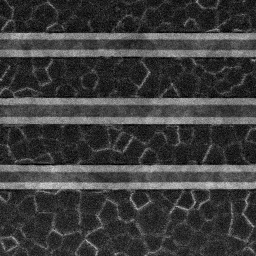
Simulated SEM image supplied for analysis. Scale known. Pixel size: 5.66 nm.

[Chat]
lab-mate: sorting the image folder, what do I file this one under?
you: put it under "one or a few lines or trenches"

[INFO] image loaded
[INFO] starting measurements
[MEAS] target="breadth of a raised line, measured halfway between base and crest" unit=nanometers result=94.7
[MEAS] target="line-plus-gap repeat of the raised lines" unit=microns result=0.374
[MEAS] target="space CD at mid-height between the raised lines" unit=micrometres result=0.274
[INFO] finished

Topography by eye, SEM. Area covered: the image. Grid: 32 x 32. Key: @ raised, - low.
--------------------------------
--------------------------------
--------------------------------
--------------------------------
--------------------------------
@@@@@@@@@@@@@@@@@@@@@@@@@@@@@@@@
@@@@@@@@@@@@@@@@@@@@@@@@@@@@@@@@
--------------------------------
--------------------------------
--------------------------------
--------------------------------
--------------------------------
--------------------------------
@@@@@@@@@@@@@@@@@@@@@@@@@@@@@@@@
@@@@@@@@@@@@@@@@@@@@@@@@@@@@@@@@
--------------------------------
--------------------------------
--------------------------------
--------------------------------
--------------------------------
--------------------------------
@@@@@@@@@@@@@@@@@@@@@@@@@@@@@@@@
@@@@@@@@@@@@@@@@@@@@@@@@@@@@@@@@
--------------------------------
--------------------------------
--------------------------------
--------------------------------
--------------------------------
--------------------------------
--------------------------------
--------------------------------
--------------------------------